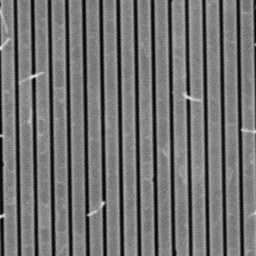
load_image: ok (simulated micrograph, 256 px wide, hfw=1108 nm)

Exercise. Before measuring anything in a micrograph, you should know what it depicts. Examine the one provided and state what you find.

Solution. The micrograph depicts parallel lines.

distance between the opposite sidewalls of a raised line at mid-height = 13.1 pixels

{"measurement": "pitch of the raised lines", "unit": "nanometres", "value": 74.2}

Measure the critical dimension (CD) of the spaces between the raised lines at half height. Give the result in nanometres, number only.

16.2